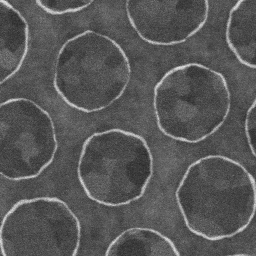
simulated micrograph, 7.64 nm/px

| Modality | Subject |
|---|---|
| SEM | raised bodies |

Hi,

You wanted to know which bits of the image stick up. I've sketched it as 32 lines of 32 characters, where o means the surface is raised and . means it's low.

o....oooooo.....oooooooooo....oo
oo....oo........oooooooooo...ooo
ooo.............oooooooooo...ooo
ooo..............oooooooo...oooo
ooo.......ooo.....oooooo....oooo
ooo.....oooooo...............ooo
ooo.....ooooooo..............ooo
ooo....ooooooooo..............oo
oo.....ooooooooo......oooo......
o......ooooooooo.....ooooooo....
.......ooooooooo....oooooooo....
.......oooooooo....oooooooooo...
..o.....oooooo.....oooooooooo...
ooooo.....ooo......oooooooooo..o
oooooo..............oooooooo...o
ooooooo.............oooooooo...o
ooooooo......oo.....ooooooo....o
ooooooo....ooooooo.....oo......o
ooooooo...oooooooo.............o
ooooooo...ooooooooo.............
oooooo....ooooooooo.....oooooo..
ooooo.....ooooooooo....oooooooo.
..........oooooooo.....ooooooooo
...........ooooooo....oooooooooo
...........oooooo.....oooooooooo
..oooooo.....oo.......oooooooooo
.oooooooo..............ooooooooo
.ooooooooo.............oooooooo.
oooooooooo..............oooooo..
oooooooooo.....ooooo.....ooo....
oooooooooo....ooooooo...........
ooooooooo....ooooooooo..........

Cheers